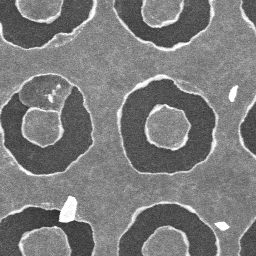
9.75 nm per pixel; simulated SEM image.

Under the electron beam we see ring-shaped grooves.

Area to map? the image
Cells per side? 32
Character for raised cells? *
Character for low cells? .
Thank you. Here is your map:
..******....**....*****...****..
..*****....****...*****...****..
....**.....****...****....*****.
.........*******..........******
.......**********.......********
**....*************....*********
********************************
********************************
********************************
*****..*************************
***......*********....**********
**........******.......*********
*.........******..........******
...........****.....**....*****.
...****....****....****....****.
...*****...****...******...***..
...*****....***...******...***..
....***.....***....****....***..
*..........*****....**....*****.
**........******..........******
**.......*******.........*******
****...**********.....**********
********************************
********************************
********************************
********************..**********
**.....**********.......********
........*********........*******
.....**....*****....**....*****.
...*****....***....****....***..
..*******...***...*****....***..
...******...***...******...***..